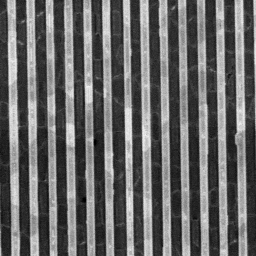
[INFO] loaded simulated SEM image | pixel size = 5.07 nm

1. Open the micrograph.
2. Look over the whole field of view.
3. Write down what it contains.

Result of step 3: parallel lines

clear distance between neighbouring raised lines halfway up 64.6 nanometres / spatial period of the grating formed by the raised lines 96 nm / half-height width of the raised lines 34.9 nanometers